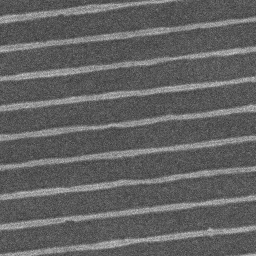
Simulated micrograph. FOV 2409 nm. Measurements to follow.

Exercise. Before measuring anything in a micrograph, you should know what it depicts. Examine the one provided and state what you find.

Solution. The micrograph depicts parallel lines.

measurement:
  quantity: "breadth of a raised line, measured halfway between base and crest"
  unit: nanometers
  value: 50.2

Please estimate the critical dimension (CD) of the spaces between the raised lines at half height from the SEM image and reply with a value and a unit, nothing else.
23.8 px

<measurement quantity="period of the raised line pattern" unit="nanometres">278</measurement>